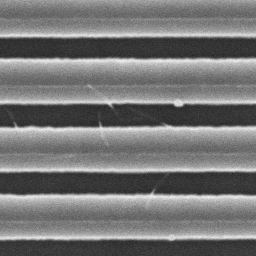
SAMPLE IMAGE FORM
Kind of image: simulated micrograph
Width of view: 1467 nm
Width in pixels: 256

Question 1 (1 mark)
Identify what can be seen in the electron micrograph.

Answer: lines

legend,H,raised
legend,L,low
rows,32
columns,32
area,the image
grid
HHHHHHHHHHHHHHHHHHHHHHHHHHHHHHHH
HHHHHHHHHHHHHHHHHHHHHHHHHHHHHHHH
HHHHHHHHHHHHHHHHHHHHHHHHHHHHHHHH
HHHHHHHHHHHHHHHHHHHHHHHHHHHHHHHH
LLLLLLLLLLLLLLLLLLLLLLLLLLLLLLLL
LLLLLLLLLLLLLLLLLLLLLLLLLLLLLLLL
LLLLLLLLLLLLLLLLLLLLLLLLLLLLLLLL
HHHHHHHHHHHHHHHHHHHHHHHHHHHHHHHH
HHHHHHHHHHHHHHHHHHHHHHHHHHHHHHHH
HHHHHHHHHHHHHHHHHHHHHHHHHHHHHHHH
HHHHHHHHHHHHHHHHHHHHHHHHHHHHHHHH
HHHHHHHHHHHHHHHHHHHHHHHHHHHHHHHH
HHHHHHHHHHHHHHHHHHHHHHHHHHHHHHHH
LLLLLLLLLLLLLLLLLLLLLLLLLLLLLLLL
LLLLLLLLLLLLLLLLLLLLLLLLLLLLLLLL
LLLLLLLLLLLLLLLLLLLLLLLLLLLLLLLL
HHHHHHHHHHHHHHHHHHHHHHHHHHHHHHHH
HHHHHHHHHHHHHHHHHHHHHHHHHHHHHHHH
HHHHHHHHHHHHHHHHHHHHHHHHHHHHHHHH
HHHHHHHHHHHHHHHHHHHHHHHHHHHHHHHH
HHHHHHHHHHHHHHHHHHHHHHHHHHHHHHHH
LLLLLLLLLLLLLLLLLLLLLLLLLLLLLLLL
LLLLLLLLLLLLLLLLLLLLLLLLLLLLLLLL
LLLLLLLLLLLLLLLLLLLLLLLLLLLLLLLL
HHLLLHHLLLLHLLLLLHHHLLLLLLLLLLLL
HHHHHHHHHHHHHHHHHHHHHHHHHHHHHHHH
HHHHHHHHHHHHHHHHHHHHHHHHHHHHHHHH
HHHHHHHHHHHHHHHHHHHHHHHHHHHHHHHH
HHHHHHHHHHHHHHHHHHHHHHHHHHHHHHHH
HHHHHHHHHHHHHHHHHHHHHHHHHHHHHHHH
LLLLLLLLLLLLLLLLLLLLLLLLLLLLLLLL
LLLLLLLLLLLLLLLLLLLLLLLLLLLLLLLL